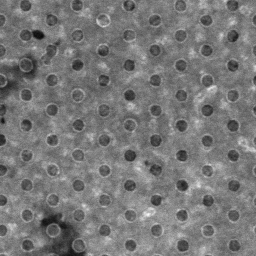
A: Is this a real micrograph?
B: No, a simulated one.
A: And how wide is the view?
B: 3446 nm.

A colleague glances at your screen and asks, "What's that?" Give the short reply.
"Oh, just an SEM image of a regular array of raised bodies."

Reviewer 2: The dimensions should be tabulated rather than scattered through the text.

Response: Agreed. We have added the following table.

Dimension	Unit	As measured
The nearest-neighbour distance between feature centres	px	29.6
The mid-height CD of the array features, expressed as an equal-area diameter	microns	0.178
